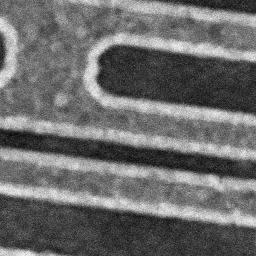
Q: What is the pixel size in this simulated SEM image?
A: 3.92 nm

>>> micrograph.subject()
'one or a few lines or trenches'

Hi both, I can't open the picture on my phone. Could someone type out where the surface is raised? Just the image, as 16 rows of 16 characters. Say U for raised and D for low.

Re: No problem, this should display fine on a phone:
UUUUUUUUUUDDDDDD
UUUUUUUUUUUUUUUU
DUUUUUUDUUUUUUUU
DUUUUUDDDDDDDDDD
UUUUUUDDDDDDDDDD
UUUUUUDDDDDDDDDD
UUUUUUUUDDDDDDDD
UUUUUUUUUUUUUUUD
DDDDDDDUUUUUUUUU
DDDDDDDDDDDDDDDU
UUUUUUUDDDDDDDDD
UUUUUUUUUUUUUUUD
DDDDDDUUUUUUUUUU
DDDDDDDDDDDDDUUU
DDDDDDDDDDDDDDDD
DDDDDDDDDDDDDDDD